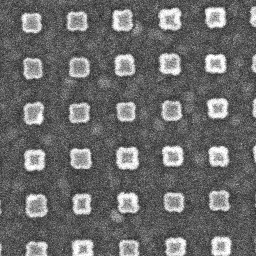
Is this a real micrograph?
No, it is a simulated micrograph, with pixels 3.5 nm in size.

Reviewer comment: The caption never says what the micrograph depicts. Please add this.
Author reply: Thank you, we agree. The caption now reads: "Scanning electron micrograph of a regular array of raised bodies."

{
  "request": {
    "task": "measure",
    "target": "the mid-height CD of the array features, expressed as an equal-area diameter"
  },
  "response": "69 nm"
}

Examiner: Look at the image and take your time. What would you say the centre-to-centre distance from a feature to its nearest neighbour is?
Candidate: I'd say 158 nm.